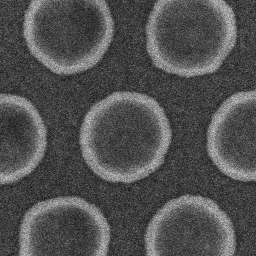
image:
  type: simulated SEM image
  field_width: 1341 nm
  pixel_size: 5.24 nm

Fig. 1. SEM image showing raised bodies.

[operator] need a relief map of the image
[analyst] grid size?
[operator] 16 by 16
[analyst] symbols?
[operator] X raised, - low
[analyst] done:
--XXXXX---XXXX--
--XXXXX--XXXXX--
--XXXXX--XXXXX--
--XXXX----XXXX--
-----------XX---
----------------
XX----XXXX----XX
XX---XXXXX----XX
XXX--XXXXX---XXX
XXX--XXXXX---XXX
XX----XXX-----XX
----------------
-----------X----
--XXXX----XXXX--
-XXXXXX--XXXXX--
-XXXXXX--XXXXX--